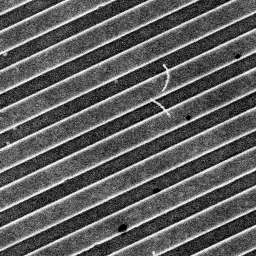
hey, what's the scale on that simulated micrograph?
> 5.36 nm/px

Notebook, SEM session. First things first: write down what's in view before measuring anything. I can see parallel lines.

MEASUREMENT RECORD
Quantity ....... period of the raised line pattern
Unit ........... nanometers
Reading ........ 190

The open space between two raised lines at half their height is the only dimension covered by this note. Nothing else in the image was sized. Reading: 14.6 px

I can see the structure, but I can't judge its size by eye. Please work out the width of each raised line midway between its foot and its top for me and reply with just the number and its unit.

115 nanometres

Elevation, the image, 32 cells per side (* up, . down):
***....******.....******....****
*....******.....******....******
...******....******.....******..
.******....******.....******....
*****....******.....******....**
***....******....*******....****
*....******....*******....******
...******....******.....******..
.******....******.....******....
*****....******.....******....**
***....******....******.....****
.....******....******....*******
...******....******....*******..
.******....******....******.....
*****....******....******.....**
***....******....******.....****
.....******....******....******.
...******....******....******...
*******....******....******.....
****.....******....******....***
**....*******....******....*****
....******.....******....******.
..******.....******....******...
******.....******....******....*
****.....*****.....******....***
**....******.....******....*****
....******.....******....******.
..******.....******....******...
******....*******....******....*
****....*******....******....***
**....******.....******....*****
....******....*******....******.